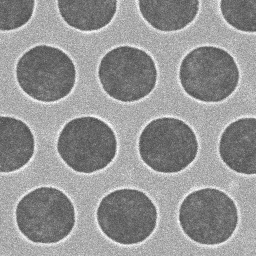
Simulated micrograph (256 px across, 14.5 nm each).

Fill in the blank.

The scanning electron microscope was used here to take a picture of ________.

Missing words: a regular array of holes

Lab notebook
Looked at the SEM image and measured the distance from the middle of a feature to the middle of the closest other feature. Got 81.4 px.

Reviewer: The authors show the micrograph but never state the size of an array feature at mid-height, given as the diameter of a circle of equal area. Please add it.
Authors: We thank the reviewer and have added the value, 845 nm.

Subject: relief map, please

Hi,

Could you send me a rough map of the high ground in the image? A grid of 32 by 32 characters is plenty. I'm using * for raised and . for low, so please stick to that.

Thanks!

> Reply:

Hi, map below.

....***........**........***....
....***.......****.......***....
....****......****......****....
..*******....******....******...
********************************
********************************
***.....******....******....****
**.......****......****......***
**.......***........***.......**
**.......***........**........**
**.......****......****.......**
***......****......****......***
*****..********..********...****
********************************
********************************
...*****.....******....******...
....****......****......****....
....***........**........**.....
....***........**........**.....
....****......****......****....
...*****......****......****....
.*********..********..********..
********************************
*****..*************************
***.....*****.....*****......***
**.......***.......****......***
**.......***........**........**
**.......***........**........**
**.......****......****.......**
***.....*****......****......***
***************..********..*****
********************************